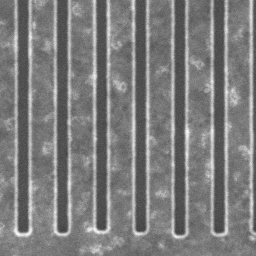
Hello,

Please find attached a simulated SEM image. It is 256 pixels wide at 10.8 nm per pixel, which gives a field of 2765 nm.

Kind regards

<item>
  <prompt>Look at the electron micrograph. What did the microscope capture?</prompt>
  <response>parallel lines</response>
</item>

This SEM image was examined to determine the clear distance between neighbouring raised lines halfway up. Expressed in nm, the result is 140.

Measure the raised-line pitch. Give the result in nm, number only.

424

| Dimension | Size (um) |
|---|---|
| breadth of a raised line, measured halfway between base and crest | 0.28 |